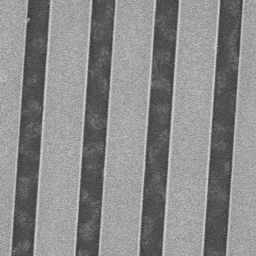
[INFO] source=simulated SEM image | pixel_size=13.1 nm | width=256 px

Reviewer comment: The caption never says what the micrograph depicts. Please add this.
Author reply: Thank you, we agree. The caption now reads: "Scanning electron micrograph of one or a few lines or trenches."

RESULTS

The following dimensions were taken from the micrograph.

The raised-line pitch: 836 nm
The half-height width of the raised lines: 0.507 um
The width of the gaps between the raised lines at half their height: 321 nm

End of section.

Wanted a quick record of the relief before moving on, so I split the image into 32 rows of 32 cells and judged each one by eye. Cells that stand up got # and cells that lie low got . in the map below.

###...#####....####....####...##
###...#####...#####...#####...##
###...#####...#####...#####...##
###...#####...#####...#####...##
###...#####...#####...#####...##
###...#####...#####...#####...##
###...#####...#####...#####...##
###...#####...#####...#####...##
###...#####...#####...#####...##
###...#####...#####...#####...##
###...#####...#####...#####...##
###...#####...#####...#####...##
###...#####...#####...#####...##
##...######...####....####....##
##....####....####....####....##
##...#####....####....####...###
##...#####...#####...#####...###
##...#####...#####...#####...###
##...#####...#####...#####...###
##...#####...#####...#####...###
##...#####...#####...#####...###
##...#####...#####...#####...###
##...#####...#####...#####...###
##...#####...#####...#####...###
##...#####...#####...#####...###
##...#####...#####...#####...###
##...#####...#####...#####...###
##...#####...#####...#####...###
#...######...####....####....###
#...#####....####....####....###
#...#####....####....####...####
#...#####...#####....####...####